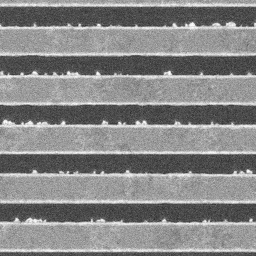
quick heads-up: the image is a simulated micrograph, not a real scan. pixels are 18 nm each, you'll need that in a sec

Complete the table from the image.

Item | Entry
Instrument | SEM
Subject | lines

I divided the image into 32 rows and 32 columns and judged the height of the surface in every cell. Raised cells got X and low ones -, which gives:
XXXXXXXXXXXXXXXXXXXXXXXXXXXXXXXX
--------------------------------
--------------------------------
XXXXXXXXXXXXXXXXXXXXXXXXXXXXXXXX
XXXXXXXXXXXXXXXXXXXXXXXXXXXXXXXX
XXXXXXXXXXXXXXXXXXXXXXXXXXXXXXXX
XXXXXXXXXXXXXXXXXXXXXXXXXXXXXXXX
--------------------------------
--------------------------------
XXXXXXXXXXXXXXXXXXXXXXXXXXXXXXXX
XXXXXXXXXXXXXXXXXXXXXXXXXXXXXXXX
XXXXXXXXXXXXXXXXXXXXXXXXXXXXXXXX
XXXXXXXXXXXXXXXXXXXXXXXXXXXXXXXX
--------------------------------
--------------------------------
--------------------------------
XXXXXXXXXXXXXXXXXXXXXXXXXXXXXXXX
XXXXXXXXXXXXXXXXXXXXXXXXXXXXXXXX
XXXXXXXXXXXXXXXXXXXXXXXXXXXXXXXX
--------------------------------
--------------------------------
--------------------------------
XXXXXXXXXXXXXXXXXXXXXXXXXXXXXXXX
XXXXXXXXXXXXXXXXXXXXXXXXXXXXXXXX
XXXXXXXXXXXXXXXXXXXXXXXXXXXXXXXX
--------------------------------
--------------------------------
--------------------------------
XXXXXXXXXXXXXXXXXXXXXXXXXXXXXXXX
XXXXXXXXXXXXXXXXXXXXXXXXXXXXXXXX
XXXXXXXXXXXXXXXXXXXXXXXXXXXXXXXX
--------------------------------